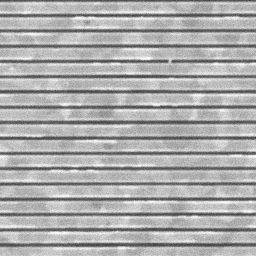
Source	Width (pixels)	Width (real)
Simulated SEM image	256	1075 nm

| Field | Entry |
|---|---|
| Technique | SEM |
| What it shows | parallel lines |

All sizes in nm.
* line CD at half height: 46.1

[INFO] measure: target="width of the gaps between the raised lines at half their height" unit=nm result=21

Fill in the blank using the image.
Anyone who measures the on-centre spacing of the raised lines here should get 64.2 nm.